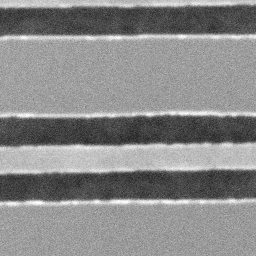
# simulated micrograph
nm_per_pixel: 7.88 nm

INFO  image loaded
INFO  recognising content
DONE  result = lines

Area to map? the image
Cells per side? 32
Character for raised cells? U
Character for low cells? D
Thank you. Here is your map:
UUUUUUUUUUUUUUUUUUUUUUUUUUDUDUDD
DDDDDDDDDDDDDDDDDDDDDDDDDDDDDDDD
DDDDDDDDDDDDDDDDDDDDDDDDDDDDDDDD
DDDDDDDDDDDDDDDDDDDDDDDDDDDDDDDD
DDDDDDDDDDDDDDDDDDDDDDDDDDDDDDDD
UUUUUUUUUUUUUUUUUUUUUUUUUUUUUUUU
UUUUUUUUUUUUUUUUUUUUUUUUUUUUUUUU
UUUUUUUUUUUUUUUUUUUUUUUUUUUUUUUU
UUUUUUUUUUUUUUUUUUUUUUUUUUUUUUUU
UUUUUUUUUUUUUUUUUUUUUUUUUUUUUUUU
UUUUUUUUUUUUUUUUUUUUUUUUUUUUUUUU
UUUUUUUUUUUUUUUUUUUUUUUUUUUUUUUU
UUUUUUUUUUUUUUUUUUUUUUUUUUUUUUUU
UUUUUUUUUUUUUUUUUUUUUUUUUUUUUUUU
UDUUUUUUUUUUUUUDDDDDDDDDDDDDDDDD
DDDDDDDDDDDDDDDDDDDDDDDDDDDDDDDD
DDDDDDDDDDDDDDDDDDDDDDDDDDDDDDDD
DDDDDDDDDDDDDDDDDDDDDDDDDDDDDDDD
UUUUUUUUUUUUUUUUUUUUUUUUUUUUUUUU
UUUUUUUUUUUUUUUUUUUUUUUUUUUUUUUU
UUUUUUUUUUUUUUUUUUUUUUUUUUUUUUUU
UUUUUDDDDDDDDDDDDDDDDDDDDDDDDDDD
DDDDDDDDDDDDDDDDDDDDDDDDDDDDDDDD
DDDDDDDDDDDDDDDDDDDDDDDDDDDDDDDD
DDDDDDDDDDDDDDDDDDDDDDDDDDDDDDDD
UUUUUUUUUUUUUUUUUUUUUUUUUUUUUUUU
UUUUUUUUUUUUUUUUUUUUUUUUUUUUUUUU
UUUUUUUUUUUUUUUUUUUUUUUUUUUUUUUU
UUUUUUUUUUUUUUUUUUUUUUUUUUUUUUUU
UUUUUUUUUUUUUUUUUUUUUUUUUUUUUUUU
UUUUUUUUUUUUUUUUUUUUUUUUUUUUUUUU
UUUUUUUUUUUUUUUUUUUUUUUUUUUUUUUU